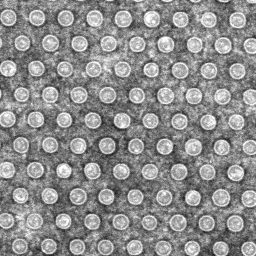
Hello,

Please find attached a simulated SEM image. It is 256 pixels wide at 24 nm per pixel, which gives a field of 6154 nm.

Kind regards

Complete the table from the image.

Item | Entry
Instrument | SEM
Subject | a regular array of raised bodies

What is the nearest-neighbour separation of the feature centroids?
685 nm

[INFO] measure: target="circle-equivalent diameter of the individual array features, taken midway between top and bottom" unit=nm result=357